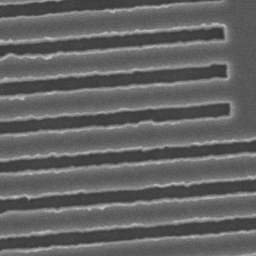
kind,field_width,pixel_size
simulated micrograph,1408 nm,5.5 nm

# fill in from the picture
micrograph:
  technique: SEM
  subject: parallel lines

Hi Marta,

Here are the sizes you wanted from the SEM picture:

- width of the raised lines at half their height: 25.3 px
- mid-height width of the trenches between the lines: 71.9 nm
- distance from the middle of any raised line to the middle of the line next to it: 38.7 px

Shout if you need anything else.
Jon